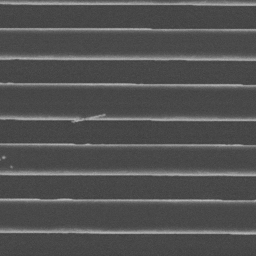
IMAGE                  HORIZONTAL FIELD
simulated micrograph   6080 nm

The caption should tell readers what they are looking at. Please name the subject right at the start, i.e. lines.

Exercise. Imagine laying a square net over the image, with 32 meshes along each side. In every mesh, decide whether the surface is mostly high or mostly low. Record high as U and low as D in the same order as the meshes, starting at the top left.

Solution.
DDDDDDDDDDDUUUUUUUUUUUUUUUUUUUUU
DDDDDDDDDDDDDDDDDDDDDDDDDDDDDDDD
DDDDDDDDDDDDDDDDDDDDDDDDDDDDDDDD
DDDDDDDDDDDDDDDDDDDDDDDDDDDDDDDD
UUUUUUUUUUUUUUUUUUUUUUUUUUUUUUUU
UUUUUUUUUUUUUUUUUUUUUUUUUUUUUUUU
UUUUUUUUUUUUUUUUUUUUUUUUUUUUUUUU
DDDDDDDDDDDDDDDDDDDDDDDDDDDDDDDD
DDDDDDDDDDDDDDDDDDDDDDDDDDDDDDDD
DDDDDDDDDDDDDDDDDDDDDDDDDDDDDDDD
DDDDDDDDDDDDDDDDDDDDDDDDDDDDDDDD
UUUUUUUUUUUUUUUUUUUUUUUUUUUUUUUU
UUUUUUUUUUUUUUUUUUUUUUUUUUUUUUUU
UUUUUUUUUUUUUUUUUUUUUUUUUUUUUUUU
UUUUUUUUUUUUUUUUUUUUUUUUUUUUUUUU
DDDDDDDDDDDDDDDDDDDDDDDDDDDDDDDD
DDDDDDDDDDDDDDDDDDDDDDDDDDDDDDDD
DDDDDDDDDDDDDDDDDDDDDDDDDDDDDDDD
UUUUUUUUUUUUUUUUUUUUUUUUUUUUUUUU
UUUUUUUUUUUUUUUUUUUUUUUUUUUUUUUU
UUUUUUUUUUUUUUUUUUUUUUUUUUUUUUUU
UUUUUUUUUUUUUUUUUUUUUUUUUUUUUUUU
DDDDDDDDDDDDDDDDDDDDDDDDDDDDDDDD
DDDDDDDDDDDDDDDDDDDDDDDDDDDDDDDD
DDDDDDDDDDDDDDDDDDDDDDDDDDDDDDDD
UUUUUUUUUUUUUUUUUUUUUUUUUUUUUUUU
UUUUUUUUUUUUUUUUUUUUUUUUUUUUUUUU
UUUUUUUUUUUUUUUUUUUUUUUUUUUUUUUU
UUUUUUUUUUUUUUUUUUUUUUUUUUUUUUUU
DDDDDDDDDDDDDDDDDDDDDDDDDDDDDDDD
DDDDDDDDDDDDDDDDDDDDDDDDDDDDDDDD
DDDDDDDDDDDDDDDDDDDDDDDDDDDDDDDD